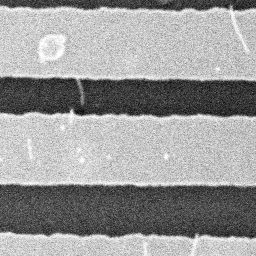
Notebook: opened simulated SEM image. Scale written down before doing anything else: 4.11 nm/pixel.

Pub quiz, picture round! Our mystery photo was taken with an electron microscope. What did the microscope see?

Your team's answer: lines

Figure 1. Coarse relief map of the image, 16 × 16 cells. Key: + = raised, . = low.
++.++...........
++++++++++++++++
++++++++++++++++
++++++++++++++++
++++++++++++++++
................
................
++++++++++++++++
++++++++++++++++
++++++++++++++++
++++++++++++++++
.+++.+++++++++++
................
................
................
++++++++++++++++